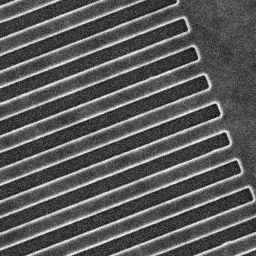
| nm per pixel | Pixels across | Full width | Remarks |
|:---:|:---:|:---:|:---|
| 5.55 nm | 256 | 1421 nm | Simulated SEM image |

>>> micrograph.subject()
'parallel lines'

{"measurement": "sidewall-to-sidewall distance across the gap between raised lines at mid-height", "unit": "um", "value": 0.0802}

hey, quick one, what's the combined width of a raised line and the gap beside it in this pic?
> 168 nm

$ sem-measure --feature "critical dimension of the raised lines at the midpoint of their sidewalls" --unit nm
85.5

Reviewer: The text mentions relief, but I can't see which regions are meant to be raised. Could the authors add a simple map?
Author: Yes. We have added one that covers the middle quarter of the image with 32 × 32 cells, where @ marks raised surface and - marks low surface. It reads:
--------@@@@@@@@@@@@----------@@
------@@@@@@@@@@@----------@@@@@
---@@@@@@@@@@@-----------@@@@@@@
-@@@@@@@@@@@----------@@@@@@@@@@
@@@@@@@@@----------@@@@@@@@@@@--
@@@@@@@----------@@@@@@@@@@-----
@@@@----------@@@@@@@@@@@-------
@-----------@@@@@@@@@@----------
---------@@@@@@@@@@@----------@@
------@@@@@@@@@@@-----------@@@@
----@@@@@@@@@@-----------@@@@@@@
-@@@@@@@@@@@-----------@@@@@@@@@
@@@@@@@@@-----------@@@@@@@@@@@-
@@@@@@@----------@@@@@@@@@@@----
@@@@-----------@@@@@@@@@@-------
@-----------@@@@@@@@@@@---------
----------@@@@@@@@@@----------@@
-------@@@@@@@@@@@----------@@@@
----@@@@@@@@@@@----------@@@@@@@
--@@@@@@@@@@-----------@@@@@@@@@
@@@@@@@@@@----------@@@@@@@@@@@-
@@@@@@@----------@@@@@@@@@@@----
@@@@-----------@@@@@@@@@@-------
@@----------@@@@@@@@@@@---------
---------@@@@@@@@@@@----------@@
-------@@@@@@@@@@@----------@@@@
----@@@@@@@@@@@-----------@@@@@@
--@@@@@@@@@@-----------@@@@@@@@@
@@@@@@@@@@----------@@@@@@@@@@@-
@@@@@@@-----------@@@@@@@@@@@---
@@@@-----------@@@@@@@@@@@------
@@-----------@@@@@@@@@@---------